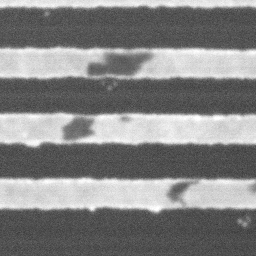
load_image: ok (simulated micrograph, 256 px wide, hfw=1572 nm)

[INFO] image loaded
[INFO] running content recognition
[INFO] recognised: lines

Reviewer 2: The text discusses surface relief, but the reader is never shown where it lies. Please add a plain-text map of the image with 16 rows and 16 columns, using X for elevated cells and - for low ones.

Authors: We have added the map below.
----------------
----------------
----------------
XXXXXXXXXXXXXXXX
XXXXXXXXXXXXXXXX
----------------
----------------
XXXXXXXXXXXXXXXX
XXXXXXXXXXXXXXXX
----------------
----------------
XXXXXXXXXXXXXXXX
XXXXXXXXXXXXXXXX
----------------
----------------
----------------